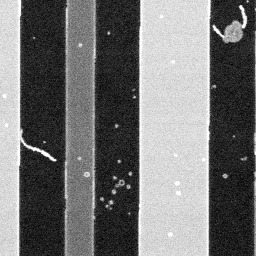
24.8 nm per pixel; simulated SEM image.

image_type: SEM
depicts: lines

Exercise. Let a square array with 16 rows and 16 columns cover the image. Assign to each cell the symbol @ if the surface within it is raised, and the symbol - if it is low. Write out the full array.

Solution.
@--------@@@@---
@--------@@@@---
@--------@@@@---
@--------@@@@---
@--------@@@@---
@--------@@@@---
@--------@@@@---
@--------@@@@---
@--------@@@@---
@--------@@@@---
@--------@@@@---
@--------@@@@---
@--------@@@@---
@--------@@@@---
@--------@@@@---
@--------@@@@---